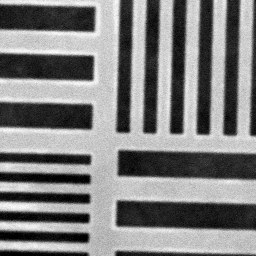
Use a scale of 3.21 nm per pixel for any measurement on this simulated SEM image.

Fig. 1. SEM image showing groups of lines, slits or small figures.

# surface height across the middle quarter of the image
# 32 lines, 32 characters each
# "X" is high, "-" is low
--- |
--------XXXXX----XXX----XX-----X
--------XXXXX----XXX----XX-----X
--------XXXXX----XXX----XX-----X
--------XXXXX----XXX----XX-----X
-------XXXXXX----XXX----XX-----X
XXXXXXXXXXXXX----XXX----XX-----X
XXXXXXXXXXXXX----XXX----XX----XX
XXXXXXXXXXXXX----XXX----XX----XX
XXXXXXXXXXXXX----XXX----XX----XX
XXXXXXXXXXXXX----XXX----XX----XX
-------XXXXXX----XXX----XX----XX
--------XXXXX----XXX----XX----XX
-------XXXXXX----XXX---XXX----XX
-------XXXXXX----XXX---XXX----XX
-------XXXXXX----XXX---XXX----XX
-------XXXXXX----XXX---XXX----XX
-------XXXXXX----XXX---XXX----XX
XXXXXXXXXXXXXXXXXXXX---XXX----XX
XXXXXXXXXXXXXXXXXXXXXXXXXXXXXXXX
XXXXXXXXXXXXXXXXXXXXXXXXXXXXXXXX
XXXXXXXXXXXXXXXXXXXXXXXXXXXXXXXX
XXXXXXXXXXXXXX---------------XXX
------XXXXXXX-------------------
-------XXXXXX-------------------
-------XXXXXX-------------------
XXXXXXXXXXXXX-------------------
XXXXXXXXXXXXX-------------------
------XXXXXXX-------------------
-------XXXXXXXXXXXXX------------
-------XXXXXXXXXXXXXXXXXXXXXXXXX
XXXXXXXXXXXXXXXXXXXXXXXXXXXXXXXX
XXXXXXXXXXXXXXXXXXXXXXXXXXXXXXXX